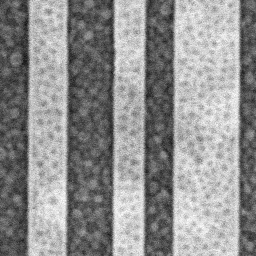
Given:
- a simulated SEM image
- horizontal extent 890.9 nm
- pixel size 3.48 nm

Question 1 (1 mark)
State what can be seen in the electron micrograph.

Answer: one or a few lines or trenches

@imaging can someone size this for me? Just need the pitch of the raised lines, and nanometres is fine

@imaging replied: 277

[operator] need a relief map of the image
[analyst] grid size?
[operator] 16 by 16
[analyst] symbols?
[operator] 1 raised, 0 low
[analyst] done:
0011000110011110
0011000110011110
0011000110011110
0011000110011110
0011000110011110
0011000110011110
0011000110011110
0011000110011110
0011000110011110
0011000110011110
0011000110011110
0011000110011110
0011000110011110
0011000110011110
0011000110011110
0011000110011110